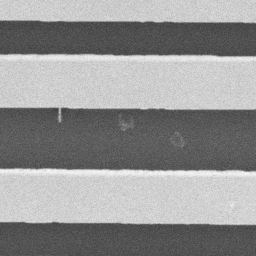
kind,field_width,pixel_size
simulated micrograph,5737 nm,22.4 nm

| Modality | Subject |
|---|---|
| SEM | lines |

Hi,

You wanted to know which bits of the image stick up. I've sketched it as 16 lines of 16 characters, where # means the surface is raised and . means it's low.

################
................
................
................
################
################
################
................
................
................
................
################
################
################
................
................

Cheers